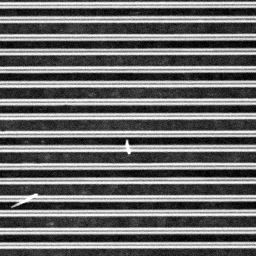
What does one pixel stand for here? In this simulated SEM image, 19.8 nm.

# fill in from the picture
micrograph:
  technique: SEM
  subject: parallel lines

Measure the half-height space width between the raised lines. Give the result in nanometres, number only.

190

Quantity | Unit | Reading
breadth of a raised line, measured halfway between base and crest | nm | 93.9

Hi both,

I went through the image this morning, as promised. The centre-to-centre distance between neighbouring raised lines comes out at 316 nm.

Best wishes